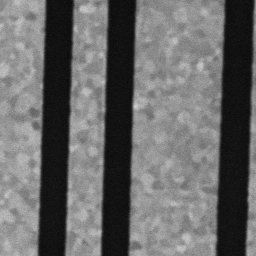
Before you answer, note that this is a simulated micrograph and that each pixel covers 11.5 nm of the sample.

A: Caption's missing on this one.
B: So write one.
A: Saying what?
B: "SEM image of lines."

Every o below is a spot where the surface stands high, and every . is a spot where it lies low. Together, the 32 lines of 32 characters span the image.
oooooo...oooo....ooooooooooo....
oooooo...oooo....ooooooooooo....
oooooo...oooo....ooooooooooo....
oooooo...oooo....ooooooooooo....
oooooo...oooo....ooooooooooo....
ooooo....oooo....ooooooooooo....
ooooo....oooo....ooooooooooo....
ooooo....oooo....ooooooooooo....
ooooo....oooo....ooooooooooo....
ooooo....oooo....ooooooooooo....
ooooo....oooo....ooooooooooo....
ooooo....oooo....ooooooooooo...o
ooooo....oooo....ooooooooooo...o
ooooo....oooo....ooooooooooo...o
ooooo....oooo....ooooooooooo...o
ooooo....oooo....oooooooooo....o
ooooo....oooo....oooooooooo....o
ooooo....oooo....oooooooooo....o
ooooo....oooo....oooooooooo....o
ooooo....oooo....oooooooooo....o
ooooo....oooo...ooooooooooo....o
ooooo....oooo...ooooooooooo....o
ooooo....oooo...ooooooooooo....o
ooooo....oooo...ooooooooooo....o
ooooo....oooo...ooooooooooo....o
ooooo...ooooo...ooooooooooo....o
ooooo...ooooo...ooooooooooo....o
ooooo...ooooo...ooooooooooo....o
ooooo...ooooo...ooooooooooo....o
ooooo...ooooo...ooooooooooo....o
ooooo...ooooo...ooooooooooo....o
ooooo...ooooo...ooooooooooo....o